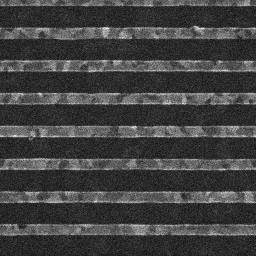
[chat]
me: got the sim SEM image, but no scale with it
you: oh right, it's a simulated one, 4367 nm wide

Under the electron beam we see parallel lines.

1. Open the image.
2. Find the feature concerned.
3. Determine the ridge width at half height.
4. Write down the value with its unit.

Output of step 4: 171 nm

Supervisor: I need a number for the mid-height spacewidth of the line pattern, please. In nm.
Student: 390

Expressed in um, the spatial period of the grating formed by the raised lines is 0.559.